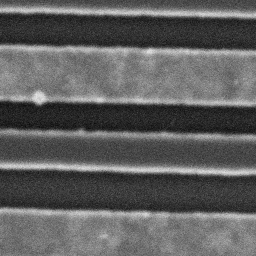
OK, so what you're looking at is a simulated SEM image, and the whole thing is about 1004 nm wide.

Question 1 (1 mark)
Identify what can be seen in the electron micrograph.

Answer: lines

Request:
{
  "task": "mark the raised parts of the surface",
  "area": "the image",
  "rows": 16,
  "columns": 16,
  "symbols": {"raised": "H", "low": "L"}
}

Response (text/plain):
HHHHHHHHHHHHHHHH
LLLLLLLLLLLLLLLL
LLLLLLLLLLLLLLLL
HHHHHHHHHHHHHHHH
HHHHHHHHHHHHHHHH
HHHHHHHHHHHHHHHH
LLLLLLLLLLLLLLLH
LLLLLLLLLLLLLLLL
HHHHHHHHHHHHHHHH
HHHHHHHHHHHHHHHH
LLLLHHHHHHHHHHHH
LLLLLLLLLLLLLLLL
LLLLLLLLLLLLLLLL
HHHHHHHHHHHHHHHH
HHHHHHHHHHHHHHHH
HHHHHHHHHHHHHHHH